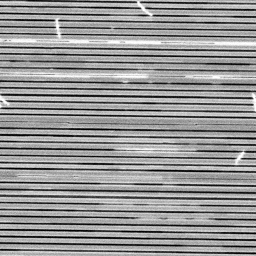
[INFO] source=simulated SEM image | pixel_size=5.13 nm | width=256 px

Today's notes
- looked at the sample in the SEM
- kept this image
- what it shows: parallel lines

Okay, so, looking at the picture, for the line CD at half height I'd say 4.76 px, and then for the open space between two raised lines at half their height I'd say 9.6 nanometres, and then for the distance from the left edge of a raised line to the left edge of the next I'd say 34.7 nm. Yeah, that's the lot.